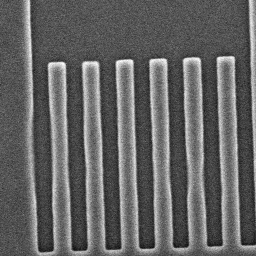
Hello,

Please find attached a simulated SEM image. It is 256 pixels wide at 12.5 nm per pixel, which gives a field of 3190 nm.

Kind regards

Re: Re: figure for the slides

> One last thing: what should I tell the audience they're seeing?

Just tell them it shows groups of lines, slits or small figures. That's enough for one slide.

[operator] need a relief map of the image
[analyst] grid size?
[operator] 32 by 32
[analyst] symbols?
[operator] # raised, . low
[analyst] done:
####...........................#
####...........................#
####...........................#
####...........................#
####...........................#
####...........................#
####...........................#
####...............#...##..##..#
####..##..##...##..##..##..##..#
####..##..##...##..##..##..##..#
####..##..##...##..##..##..##..#
####..##..##...##..##..##..##..#
####..##...#...##..##..##..##...
####..##...#...##..##..##..##...
####..##...#...##..##..##..##...
####..##...#...##..##..##..##...
####...#...##..##..##..##..###..
####...#...##..##..##..##...##..
####...#...##..##..##..##...##..
####...#...##..##..##..##...##..
####...#...##..##..##..##...##..
####...#...##..##..##...#...##..
####...#...##..##..##...#...##..
####...##..##..##..##...#...##..
####...##..##..##..##..###..##..
####...##..##..##..##..###..##..
####...##..##..##..##...##..##..
####...##..##..##..##...##..##..
####...##..##..##..##...##..##..
#####..##..##..##..##...##..##..
#####..##..##..##..###..##..##..
#####.##########################